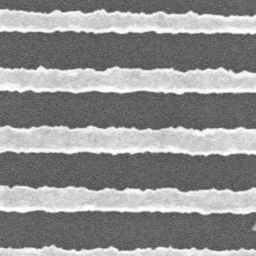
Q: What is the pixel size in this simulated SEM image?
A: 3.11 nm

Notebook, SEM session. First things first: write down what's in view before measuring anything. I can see lines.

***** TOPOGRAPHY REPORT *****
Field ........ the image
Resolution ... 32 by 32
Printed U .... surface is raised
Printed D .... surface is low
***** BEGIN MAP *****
DDDDDDDDDDDDDDDDDDDDDDDDDDDDDDDD
UUUDDDDDDDDDUDDDDDDDDDDDDDDDDDDD
UUUUUUUUUUUUUUUUUUUUUUUUUUUUUUUU
UUUUUUUUUUUUUUUUUUUUUUUUUUUUUUUU
DDDDDDDDDDDDDDDDDDDDDDDDDDDDDDDD
DDDDDDDDDDDDDDDDDDDDDDDDDDDDDDDD
DDDDDDDDDDDDDDDDDDDDDDDDDDDDDDDD
DDDDDDDDDDDDDDDDDDDDDDDDDDDDDDDD
DDDDDDDDDDDDDDUDDDDDDDDDDDDDDDDD
UUUUUUUUUUUUUUUUUUUUUUUUUUUUUUUU
UUUUUUUUUUUUUUUUUUUUUUUUUUUUUUUU
DDDDDDDDDDDDDDDDDDDDDUUDDUDDDDDD
DDDDDDDDDDDDDDDDDDDDDDDDDDDDDDDD
DDDDDDDDDDDDDDDDDDDDDDDDDDDDDDDD
DDDDDDDDDDDDDDDDDDDDDDDDDDDDDDDD
DDDDDDDDDDDDDDDDDDDDDDDDDDDDDDDD
UUUUUUUUUUUUUUUUUUUUUUUUUUUUUUUU
UUUUUUUUUUUUUUUUUUUUUUUUUUUUUUUU
UUUUUUUUUUUUUUUUUUUUUUUUUUUUUUUU
DDDDDDDDDDDDDDDDDDDDDDDDDDDDDDDD
DDDDDDDDDDDDDDDDDDDDDDDDDDDDDDDD
DDDDDDDDDDDDDDDDDDDDDDDDDDDDDDDD
DDDDDDDDDDDDDDDDDDDDDDDDDDDDDDDD
UUUUDUUDUUUDDDDDDDDDDDDDDDDDDDDD
UUUUUUUUUUUUUUUUUUUUUUUUUUUUUUUU
UUUUUUUUUUUUUUUUUUUUUUUUUUUUUUUU
DDDDDDDDDDDDDDDDDDDDDDDDDUUUUUUD
DDDDDDDDDDDDDDDDDDDDDDDDDDDDDDDD
DDDDDDDDDDDDDDDDDDDDDDDDDDDDDDDD
DDDDDDDDDDDDDDDDDDDDDDDDDDDDDDDD
DDDDDDDDDDDDDDDDDDDDDDDDDDDDDDDD
UUUUUUUUUUUUUUUUUUUUUUUUUUUDUUUU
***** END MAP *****